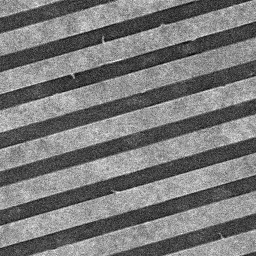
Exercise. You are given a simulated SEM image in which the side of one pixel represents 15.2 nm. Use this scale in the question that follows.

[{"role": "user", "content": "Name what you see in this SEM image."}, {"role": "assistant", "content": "parallel lines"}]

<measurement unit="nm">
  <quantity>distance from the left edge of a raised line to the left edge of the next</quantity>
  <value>560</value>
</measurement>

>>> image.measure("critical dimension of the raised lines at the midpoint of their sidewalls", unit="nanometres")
320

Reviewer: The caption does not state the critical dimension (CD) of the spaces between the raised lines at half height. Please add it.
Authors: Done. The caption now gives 236 nanometres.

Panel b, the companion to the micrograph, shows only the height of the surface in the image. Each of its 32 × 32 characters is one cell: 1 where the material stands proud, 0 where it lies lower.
11111100000001111111111000000011
11100000001111111110000000111111
00000011111111110000000111111111
00011111111100000001111111111000
11111111100000001111111111000000
11111000000011111111110000000111
11000000011111111110000000111111
00000111111111100000001111111111
00111111111100000001111111110000
11111111000000011111111110000000
11110000000011111111100000000111
10000000111111111100000001111111
00000111111111000000001111111110
01111111111000000011111111110000
11111110000000011111111100000001
11110000000111111111100000001111
00000000111111111000000011111111
00001111111111000000011111111100
11111111110000000111111111100000
11111110000000111111111000000011
11100000001111111111000000011111
00000001111111111000000111111111
00011111111110000000111111111000
11111111100000001111111111000000
11111100000001111111111000000011
11100000011111111110000000111111
00000011111111110000000111111111
00011111111100000001111111111000
11111111100000001111111110000000
11111000000011111111110000000111
11000000011111111100000000111111
00000111111111100000001111111111